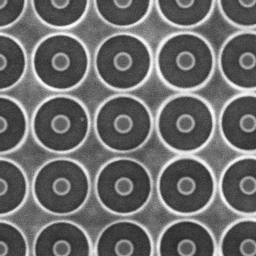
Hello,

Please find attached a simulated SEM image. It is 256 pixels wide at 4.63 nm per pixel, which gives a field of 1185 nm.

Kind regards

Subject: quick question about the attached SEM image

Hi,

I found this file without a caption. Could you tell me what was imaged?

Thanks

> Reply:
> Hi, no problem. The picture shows an array of small figures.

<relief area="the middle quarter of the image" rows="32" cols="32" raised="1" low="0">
10000011000001110000001000000111
00000011000000000000001100000000
00000111100000000000011100000000
00000111100000000000011100000000
00001111110000000000111110000000
00011111111000000011111111100000
11111111111111001111111111111101
11111111111111111111111111111111
00111111111100000011111111100000
00001111110000000001111111000000
00000111100000000000111110000000
00000111100000000000011100000000
00000011000000000000011100000000
10000011000001110000001100000111
10000011000001111000001000001111
10000011000001111000001000001111
10000011000001110000001100000111
00000011100000000000011100000000
00000111100000000000011100000000
00001111110000000000111110000000
00001111111000000001111111000000
00111111111110000111111111110000
11111111111111111111111111111111
11111111111111111111111111111000
00011111111100000011111111100000
00001111110000000001111111000000
00000111100000000000111110000000
00000111100000000000011100000000
00000011000000000000011100000000
10000011000001111000001100000111
10000011000001111000001100000111
10000011000001111000001100000111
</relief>